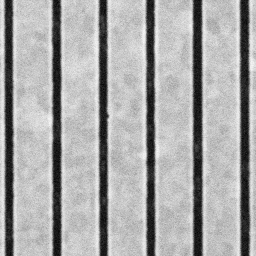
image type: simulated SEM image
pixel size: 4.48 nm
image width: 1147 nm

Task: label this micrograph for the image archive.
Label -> parallel lines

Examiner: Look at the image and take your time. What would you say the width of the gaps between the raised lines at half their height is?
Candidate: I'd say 50.4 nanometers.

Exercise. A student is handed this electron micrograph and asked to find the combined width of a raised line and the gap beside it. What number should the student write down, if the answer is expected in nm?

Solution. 211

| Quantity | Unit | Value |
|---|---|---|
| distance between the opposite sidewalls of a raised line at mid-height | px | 36.1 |